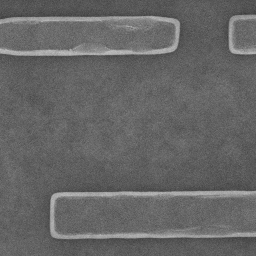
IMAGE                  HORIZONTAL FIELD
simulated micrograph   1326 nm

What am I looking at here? wiring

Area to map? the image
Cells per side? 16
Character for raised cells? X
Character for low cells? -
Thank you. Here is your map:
----------------
XXXXXXXXXXX----X
XXXXXXXXXXX---XX
----------------
----------------
----------------
----------------
----------------
----------------
----------------
----------------
----------------
---XXXXXXXXXXXXX
---XXXXXXXXXXXXX
---XXXXXXXXXXXXX
----------------